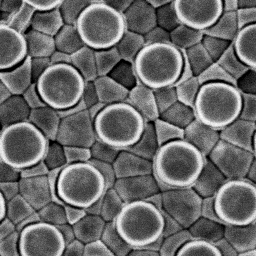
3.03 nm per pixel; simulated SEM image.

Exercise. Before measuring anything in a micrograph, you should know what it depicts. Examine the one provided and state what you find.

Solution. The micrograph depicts a regular array of raised bodies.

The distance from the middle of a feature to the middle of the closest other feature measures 0.214 µm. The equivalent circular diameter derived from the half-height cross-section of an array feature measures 42.5 pixels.